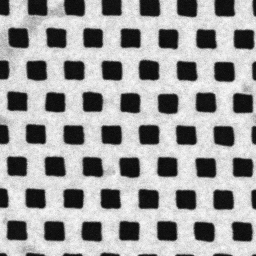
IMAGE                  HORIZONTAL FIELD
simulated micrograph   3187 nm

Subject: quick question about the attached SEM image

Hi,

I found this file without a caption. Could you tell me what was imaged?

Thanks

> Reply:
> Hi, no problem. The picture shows a regular array of holes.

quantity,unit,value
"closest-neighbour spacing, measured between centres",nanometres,457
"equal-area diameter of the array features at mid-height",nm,275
